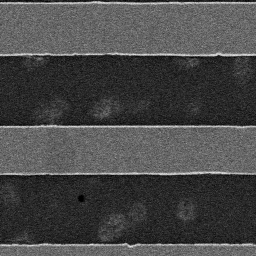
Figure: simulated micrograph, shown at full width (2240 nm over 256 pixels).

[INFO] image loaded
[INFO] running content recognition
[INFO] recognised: one or a few lines or trenches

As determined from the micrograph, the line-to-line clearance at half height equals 625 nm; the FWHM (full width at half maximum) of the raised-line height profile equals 0.431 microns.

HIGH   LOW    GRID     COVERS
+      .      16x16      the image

++++++++++++++++
++++++++++++++++
++++++++++++++++
................
................
................
................
................
++++++++++++++++
++++++++++++++++
++++++++++++++++
................
................
................
................
++++++++++++++++